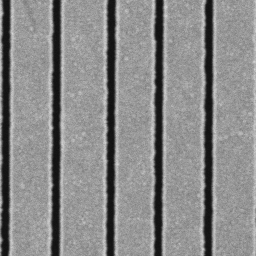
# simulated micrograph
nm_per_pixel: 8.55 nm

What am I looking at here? lines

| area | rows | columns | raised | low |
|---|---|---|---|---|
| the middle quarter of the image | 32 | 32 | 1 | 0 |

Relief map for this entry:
11111111111001111111111001111111
11111111111001111111111001111111
11111111111001111111111001111111
11111111111001111111111001111111
11111111111001111111111001111111
11111111111001111111111001111111
11111111111001111111111001111111
11111111111001111111111001111111
11111111111001111111111001111111
11111111111001111111111001111111
11111111111001111111111001111111
11111111111001111111111001111111
11111111111001111111111001111111
11111111111001111111111001111111
11111111111001111111111001111111
11111111111001111111111001111111
11111111111001111111111001111111
11111111111001111111111001111111
11111111111001111111111001111111
11111111111001111111111001111111
11111111111001111111111001111111
11111111111001111111111001111111
11111111111001111111111001111111
11111111111001111111111001111111
11111111111001111111110001111111
11111111111001111111111001111111
11111111111001111111111001111111
11111111111001111111111001111111
11111111111001111111111001111111
11111111111001111111111001111111
11111111111001111111111001111111
11111111111001111111111001111111